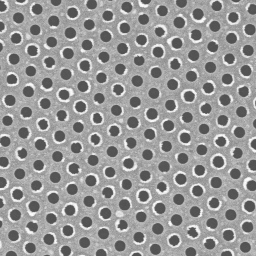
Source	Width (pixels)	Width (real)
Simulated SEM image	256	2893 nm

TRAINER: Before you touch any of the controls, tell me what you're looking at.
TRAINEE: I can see a regular array of holes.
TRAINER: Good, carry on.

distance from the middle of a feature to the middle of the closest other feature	0.229	microns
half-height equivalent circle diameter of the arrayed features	0.124	µm